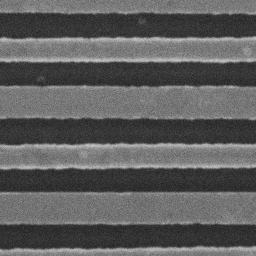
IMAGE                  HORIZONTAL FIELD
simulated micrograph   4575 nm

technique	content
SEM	lines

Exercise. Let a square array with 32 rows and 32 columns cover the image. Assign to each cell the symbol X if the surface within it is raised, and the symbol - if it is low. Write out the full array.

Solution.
XXXXXXXXXXXXXXXXXXXXXXXXXXXXXXXX
-------XXXXXXXXXXX-XXXXXXXXXXXXX
--------------------------------
--------------------------------
--------------------------------
XXXXXXXXXXXXXXXXXXXXXXXXXXXXXXXX
XXXXXXXXXXXXXXXXXXXXXXXXXXXXXXXX
X---XXX--X-XXXXXX------XXXXXXXXX
--------------------------------
--------------------------------
--------------------------------
XXXXXXXXXXXXXXXXXXXXXXXXXXXXXXXX
XXXXXXXXXXXXXXXXXXXXXXXXXXXXXXXX
XXXXXXXXXXXXXXXXXXXXXXXXXXXXXXXX
XXXXXXXXXXXXXXXXXXXXXXXXXXXXXXXX
--------------------------------
--------------------------------
--------------------------------
XXXXXXXXXXXXXXXXXXXXXXXXXXXXXXXX
XXXXXXXXXXXXXXXXXXXXXXXXXXXXXXXX
XXXXXXXXXXXXXXXXXXXXXXXXXXXXXXXX
--------------------------------
--------------------------------
--------------------------------
XXXXXXXXXXXXXXXXXXXXXXXXXXXXXXXX
XXXXXXXXXXXXXXXXXXXXXXXXXXXXXXXX
XXXXXXXXXXXXXXXXXXXXXXXXXXXXXXXX
XXXXXXXXXXXXXXXXXXXXXXXXXXXXXXXX
--------------------------------
--------------------------------
--------------------------------
XXXXXXXXXXXXXXXXXXXXXXXXXXXXXXXX